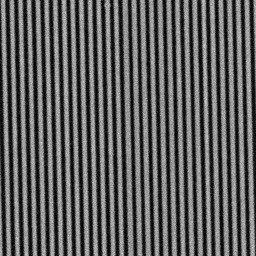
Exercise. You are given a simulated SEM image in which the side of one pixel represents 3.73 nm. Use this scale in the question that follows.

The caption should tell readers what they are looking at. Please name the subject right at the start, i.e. parallel lines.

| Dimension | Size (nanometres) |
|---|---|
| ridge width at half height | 16.3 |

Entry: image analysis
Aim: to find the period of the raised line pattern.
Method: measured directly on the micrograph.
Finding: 32.5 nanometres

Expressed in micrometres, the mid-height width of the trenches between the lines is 0.0163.